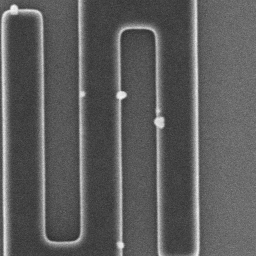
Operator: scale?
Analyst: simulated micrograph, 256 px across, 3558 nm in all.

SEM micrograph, groups of lines, slits or small figures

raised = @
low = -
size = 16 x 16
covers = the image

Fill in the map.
-----@@@@@@@----
@@@--@@@@@@@----
@@@--@@@--@@----
@@@--@@---@@----
@@@--@@---@@----
@@@--@@@--@@----
@@@--@@@--@@----
@@@--@@---@@----
@@@--@@@--@@----
@@@--@@@--@@----
@@@--@@@--@@----
@@@--@@@--@@----
@@@--@@@--@@----
@@@--@@@--@@----
@@@--@@@--@@----
@@@@@@@@--@@----